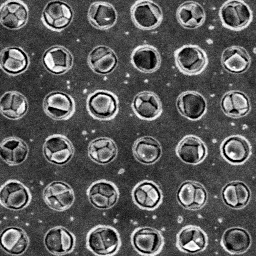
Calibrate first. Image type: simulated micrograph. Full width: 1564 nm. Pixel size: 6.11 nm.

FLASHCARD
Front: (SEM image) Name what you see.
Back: a regular array of holes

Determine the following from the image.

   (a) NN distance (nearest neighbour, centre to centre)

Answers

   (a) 268 nanometers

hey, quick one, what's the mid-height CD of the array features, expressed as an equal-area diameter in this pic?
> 147 nm